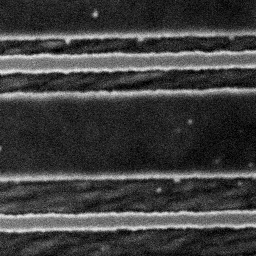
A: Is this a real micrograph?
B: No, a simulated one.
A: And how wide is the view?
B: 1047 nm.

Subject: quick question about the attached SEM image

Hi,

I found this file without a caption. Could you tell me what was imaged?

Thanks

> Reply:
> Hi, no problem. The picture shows lines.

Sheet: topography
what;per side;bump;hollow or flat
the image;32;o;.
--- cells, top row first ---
oooooooooooooooooooooooooooooooo
oooooooooooooooooooooooooooooooo
oooooooooooooooooooooooooooooooo
oooooooooooooooooooooooooooooooo
ooooooooooooooooooooo...........
................................
........................o..oo.oo
oooooooooooooooooooooooooooooooo
oooooooooooooooooooooooooooo....
................................
................................
............o.o.oooooooooooooooo
oooooooooooooooooooooooooooooooo
oooooooooooooooooooooooooooooooo
oooooooooooooooooooooooooooooooo
oooooooooooooooooooooooooooooooo
oooooooooooooooooooooooooooooooo
oooooooooooooooooooooooooooooooo
oooooooooooooooooooooooooooooooo
oooooooooooooooooooooooooooooooo
oooooooooooooooooooooooooooooooo
oooooooooooooooooooooooooooooooo
ooo.............................
................................
................................
................................
............................oooo
oooooooooooooooooooooooooooooooo
ooooooooooooooo.ooo.............
................................
................................
................................